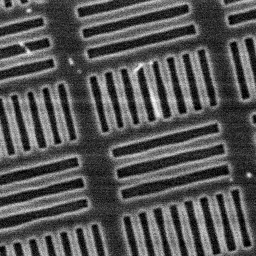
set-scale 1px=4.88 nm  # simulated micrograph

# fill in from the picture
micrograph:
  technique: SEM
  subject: groups of lines, slits or small figures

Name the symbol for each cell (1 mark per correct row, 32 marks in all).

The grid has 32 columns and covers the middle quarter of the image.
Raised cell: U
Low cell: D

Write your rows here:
UUUUUUUUUUUUUUUUUUUUUUDDUUDDUUDD
UUUUUUUUUUUUUUDDUUDDUUDDUUDDUUDD
UUUUUUUUUUDDUUDDUUDDUUDDUUDDUUDD
UUUUUUDDUUDDUUDDDUDDDUUDUUUDDUUD
UUUUUUDDDUDDDUDDDUDDDUUDDUUDDUUD
UUUUUUUDDUUDDUUDDUUDDUUDDUUDDUUD
DUUUUUUDDUUDDUUDDUUDDUUDDUUDDDUD
DUUUUUUDDDUDDUUDDDUDDDUDDDUUDDUD
DUUUUUUDDDUDDDUDDDUDDDUUDDUUDDUU
DUUUUUUUDDUUDDUUDDUUDDUUDDUUDDUU
DUUUUUUUDDUUDDUUDDUUDDUUDDUUDDDU
DDUUUUUUDDUUDDUUDDUUDDDUDDDUDDDU
DDUUUUUUDDUUUDDUUDDUUDDUUDDUUDDU
DDUUUUUUUDDUUDDUUDDUUDDUUDDUUUUU
DDUUUUUUUDDUUDDUUDDUUDUUUUUUUUUU
UDDUUUUUUDDUUDDUUUUUUUUUUUUUUUUU
UDDUUUUUUDDUUUUUUUUUUUUUUUUUUUUD
UDDUUUUUUUUUUUUUUUUUUUUUUUDDDDDD
UDDUUUUUUUUUUUUUUUUUUUUDDDDDDDDD
UUUUUUUUUUUUUUUUUUDDDDDDDDDDDDUU
UUUUUUUUUUUUUUUDDDDDDDDDDDUUUUUU
UUUUUUUUUUUUDDDDDDDDDUUUUUUUUUUU
UUUUUUUUUUUUDDDDDDUUUUUUUUUUDDDD
UDDUUUUUUUUUUUUUUUUUUUUDDDDDDDDD
DDDDUUUUUUUUUUUUUUUDDDDDDDDDDDDD
DDDDUUUUUUUUUUUDDDDDDDDDDDDDUUUU
DUUUUUUUUUUUUDDDDDDDDDDDUUUUUUUU
UUUUUUUUUUUUUDDDDDDDUUUUUUUUUUDD
UUUDDUUUUUUUUDDUUUUUUUUUUDDDDDDD
DDDDDUUUUUUUUUUUUUUUDDDDDDDDDDDD
DDDDDUUUUUUUUUUUUDDDDDDDDDDDDDUU
DDDUUUUUUUUUUUDDDDDDDDDDDDUUUUUU